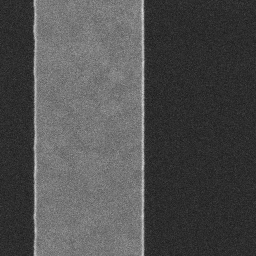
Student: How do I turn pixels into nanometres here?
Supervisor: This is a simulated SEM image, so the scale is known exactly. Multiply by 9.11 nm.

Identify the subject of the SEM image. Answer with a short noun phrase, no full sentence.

one or a few lines or trenches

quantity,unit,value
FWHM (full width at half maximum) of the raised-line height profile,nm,994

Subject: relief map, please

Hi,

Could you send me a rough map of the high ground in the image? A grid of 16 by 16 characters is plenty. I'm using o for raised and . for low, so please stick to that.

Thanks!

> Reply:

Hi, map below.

..ooooooo.......
..ooooooo.......
..ooooooo.......
..ooooooo.......
..ooooooo.......
..ooooooo.......
..ooooooo.......
..ooooooo.......
..ooooooo.......
..ooooooo.......
..ooooooo.......
..ooooooo.......
..ooooooo.......
..ooooooo.......
..ooooooo.......
..ooooooo.......